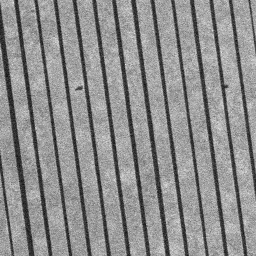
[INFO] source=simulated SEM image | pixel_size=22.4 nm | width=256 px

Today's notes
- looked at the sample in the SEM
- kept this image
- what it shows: parallel lines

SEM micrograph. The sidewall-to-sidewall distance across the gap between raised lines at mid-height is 0.102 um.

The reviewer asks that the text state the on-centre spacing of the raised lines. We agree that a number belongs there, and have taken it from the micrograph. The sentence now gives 0.431 µm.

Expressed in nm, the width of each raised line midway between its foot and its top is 330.